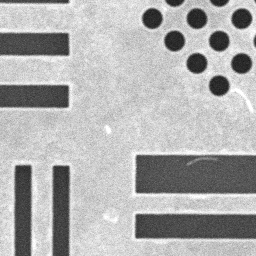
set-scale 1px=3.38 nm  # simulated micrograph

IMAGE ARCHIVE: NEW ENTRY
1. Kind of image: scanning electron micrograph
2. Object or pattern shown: groups of lines, slits or small figures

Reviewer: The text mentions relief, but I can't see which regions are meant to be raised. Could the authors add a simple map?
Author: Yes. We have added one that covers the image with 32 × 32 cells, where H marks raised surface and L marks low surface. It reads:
LLLLLLLLHHHHHHHHHHHHHLLHHHLLHHHH
HHHHHHHHHHHHHHHHHHLLHHHHLLHHHLLH
HHHHHHHHHHHHHHHHHHLLHHHLLLHHHLLL
HHHHHHHHHHHHHHHHHHLLHHHHLHHHHLLH
LLLLLLLLLHHHHHHHHHHHHLLHHHLLLHHH
LLLLLLLLLHHHHHHHHHHHLLLHHHLLLHHH
LLLLLLLLLHHHHHHHHHHHHHHHHHHLHHHH
HHHHHHHHHHHHHHHHHHHHHHHLLLHHHLLL
HHHHHHHHHHHHHHHHHHHHHHHLLLHHHLLH
HHHHHHHHHHHHHHHHHHHHHHHHHHHLHHHH
LLLLLLHHHHHHHHHHHHHHHHHHHHLLLHHH
LLLLLLLLLHHHHHHHHHHHHHHHHHLLLHHH
LLLLLLLLLHHHHHHHHHHHHHHHHHHHHHHH
LLLLLLLLHHHHHHHHHHHHHHHHHHHHHHHH
HHHHHHHHHHHHHHHHHHHHHHHHHHHHHHHH
HHHHHHHHHHHHHHHHHHHHHHHHHHHHHHHH
HHHHHHHHHHHHHHHHHHHHHHHHHHHHHHHH
HHHHHHHHHHHHHHHHHHHHHHHHHHHHHHHH
HHHHHHHHHHHHHHHHHHHHHHHHHHHHHHHH
HHHHHHHHHHHHHHHHHLLLLLLLLLLLLLLL
HHLLHHHLHHHHHHHHHLLLLLLLLLLLLLLL
HHLLHHLLLHHHHHHHHLLLLLLLLLLLLLLL
HHLLHHLLLHHHHHHHHLLLLLLLLLLLLLLL
HHLLHHLLLHHHHHHHHLLLLLLLLLLLLLLL
HHLLHHLLLHHHHHHHHHHHHHHHHHHHHHHH
HHLLHHLLLHHHHHHHHHHHHHHHHHHHHHHH
HHLLHHLLLHHHHHHHHHHHHHHHHHHHHHHH
HHLLHHLLLHHHHHHHHLLLLLLLLLLLLLLL
HHLLHHLLLHHHHHHHHLLLLLLLLLLLLLLL
HHLLHHLLLHHHHHHHHLLLLLLLLLLLLLLL
HHLLHHLLLHHHHHHHHHHHHHHHHHHHHHHH
HHLLHHLLLHHHHHHHHHHHHHHHHHHHHHHH